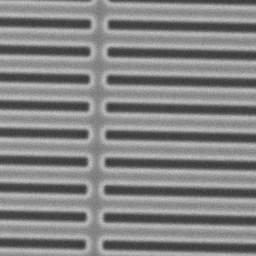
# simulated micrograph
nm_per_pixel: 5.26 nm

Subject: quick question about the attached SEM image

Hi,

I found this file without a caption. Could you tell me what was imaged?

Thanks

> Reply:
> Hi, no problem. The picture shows groups of lines, slits or small figures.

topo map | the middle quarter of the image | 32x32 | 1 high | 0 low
11111111111111111111111111111111
11111111111111111111111111111111
00000011111111111111111111111111
00000001110000000000000000000000
00000001110000000000000000000000
11111111111100000000000000000000
11111111111111111111111111111111
11111111111111111111111111111111
11111111111111111111111111111111
00000011111000111111111111111111
00000001110000000000000000000000
00000011110000000000000000000000
11111111111111111000000000000000
11111111111111111111111111111111
11111111111111111111111111111111
11111111111111111111111111111111
00000011110000000000011111111111
00000011110000000000000000000000
00000011110000000000000000000000
11111111111111111111111100000000
11111111111111111111111111111111
11111111111111111111111111111111
11111111111111111111111111111111
00000011110000000000000000011111
00000011110000000000000000000000
00000011110000000000000000000000
11111111111111111111111111111100
11111111111111111111111111111111
11111111111111111111111111111111
11111111111111111111111111111111
00000011110000000000000000000000
00000011110000000000000000000000